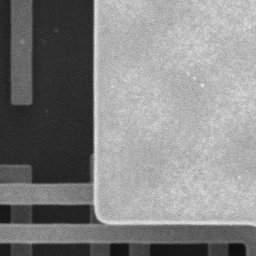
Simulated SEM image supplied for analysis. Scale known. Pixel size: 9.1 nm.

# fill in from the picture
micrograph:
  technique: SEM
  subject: wiring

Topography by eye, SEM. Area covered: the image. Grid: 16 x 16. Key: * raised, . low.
......**********
......**********
......**********
......**********
......**********
......**********
......**********
......**********
......**********
......**********
......**********
......**********
......**********
......**********
................
................